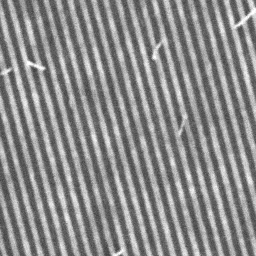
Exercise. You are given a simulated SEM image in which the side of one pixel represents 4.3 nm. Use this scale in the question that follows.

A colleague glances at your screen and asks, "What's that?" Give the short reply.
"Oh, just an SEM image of parallel lines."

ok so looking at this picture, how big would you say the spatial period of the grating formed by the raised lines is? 50.1 nm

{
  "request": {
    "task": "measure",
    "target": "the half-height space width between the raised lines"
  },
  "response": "31.7 nanometres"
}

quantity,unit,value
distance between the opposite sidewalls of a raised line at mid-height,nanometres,16.2